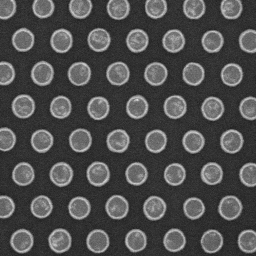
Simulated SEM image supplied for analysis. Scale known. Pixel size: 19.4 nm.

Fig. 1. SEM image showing a regular array of raised bodies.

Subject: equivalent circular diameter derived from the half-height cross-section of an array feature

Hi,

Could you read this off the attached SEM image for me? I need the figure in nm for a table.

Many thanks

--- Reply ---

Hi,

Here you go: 419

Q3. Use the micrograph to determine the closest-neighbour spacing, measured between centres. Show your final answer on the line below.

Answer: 727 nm